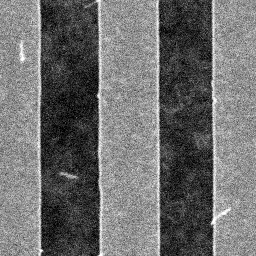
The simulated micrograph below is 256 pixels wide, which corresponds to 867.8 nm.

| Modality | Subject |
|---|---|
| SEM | one or a few lines or trenches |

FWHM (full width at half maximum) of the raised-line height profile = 0.199 um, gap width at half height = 0.194 micrometres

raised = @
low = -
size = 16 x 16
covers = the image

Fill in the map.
@@----@@@@---@@@
@@----@@@@---@@@
@@----@@@@---@@@
@@----@@@@---@@@
@@----@@@@---@@@
@@@---@@@@---@@@
@@@---@@@@---@@@
@@----@@@@---@@@
@@----@@@@---@@@
@@----@@@@---@@@
@@@---@@@@---@@@
@@@---@@@@---@@@
@@@---@@@@---@@@
@@@---@@@@---@@@
@@@---@@@@---@@@
@@@---@@@@---@@@